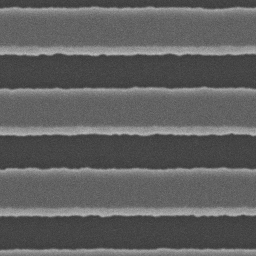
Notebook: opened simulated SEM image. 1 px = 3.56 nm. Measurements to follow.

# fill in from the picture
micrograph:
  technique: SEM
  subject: lines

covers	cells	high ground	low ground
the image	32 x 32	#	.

................................
################################
################################
################################
################################
################################
################################
................................
................................
................................
................................
################################
################################
################################
################################
################################
################################
................................
................................
................................
................................
################################
################################
################################
################################
################################
################################
................................
................................
................................
................................
################################